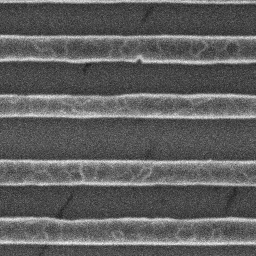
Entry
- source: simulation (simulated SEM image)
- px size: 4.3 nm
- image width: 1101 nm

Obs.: one or a few lines or trenches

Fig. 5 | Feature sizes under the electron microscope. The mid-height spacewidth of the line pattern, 152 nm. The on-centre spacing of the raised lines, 0.262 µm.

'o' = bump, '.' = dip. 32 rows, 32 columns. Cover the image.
................................
................................
................................
................................
................................
oooooooooooooooooooooooooooooooo
oooooooooooooooooooooooooooooooo
o....oooooooooooo.oooooooooooooo
................................
................................
................................
................................
oooooooooooooooooooooooooooooooo
oooooooooooooooooooooooooooooooo
oooo.ooooooooooooooooooooooooooo
................................
................................
................................
................................
................................
oooooooooooooooooooooooooooooooo
oooooooooooooooooooooooooooooooo
oooooooooooooooooooooooooooooooo
................................
................................
................................
................................
ooooooo.......ooooo.oo...ooooooo
oooooooooooooooooooooooooooooooo
oooooooooooooooooooooooooooooooo
...................ooo..........
................................